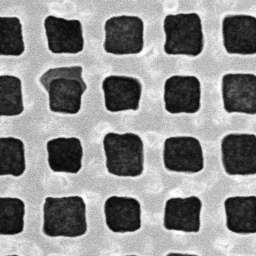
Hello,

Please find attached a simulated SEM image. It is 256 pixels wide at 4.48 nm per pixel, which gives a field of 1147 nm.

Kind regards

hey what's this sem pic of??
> a regular array of holes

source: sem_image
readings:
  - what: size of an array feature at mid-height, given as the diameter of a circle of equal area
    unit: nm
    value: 178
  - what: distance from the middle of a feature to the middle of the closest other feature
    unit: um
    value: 0.263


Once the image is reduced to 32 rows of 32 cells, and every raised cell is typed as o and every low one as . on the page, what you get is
oooooooooooooooooooooooooooooooo
oooooooooooooooooooooooooooooooo
..oooo...oooo.....ooo....ooo....
...ooo....ooo.....oo.....ooo....
...ooo....ooo.....ooo....ooo....
...ooo....ooo.....ooo....ooo....
...oooo...ooo....oooo....oooo...
oooooooooooooooooooooooooooooooo
ooooooo...oooooooooooooooooooooo
..ooo.....oooo.ooooooo.ooooo....
...oo......oo....oooo....ooo....
...ooo.....oo.....ooo....ooo....
...ooo....ooo....oooo....ooo....
...ooo....ooo....oooo....ooo....
oooooooooooooooooooooooooooooooo
oooooooooooooooooooooooooooooooo
oooooooooooooooooooooooooooooooo
..oooo....ooo.....ooo....ooo....
...ooo....ooo.....oo.....ooo....
...ooo....ooo.....oo.....ooo....
...ooo....ooo.....ooo.....oo....
...ooooo..oooo....oooooooooo....
oooooooooooooooooooooooooooooooo
oooooooooooooooooooooooooooooooo
oooooooooooooo.ooooooooooooooooo
...ooo.....oo....oooo....ooo....
...oo......oo.....oo.....ooo....
...oo......oo.....oo.....ooo....
...oo......ooo...oooo....oooo...
oooooo....oooooooooooooooooooooo
oooooooooooooooooooooooooooooooo
oooooooooooooooooooooooooooooooo